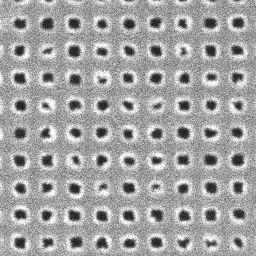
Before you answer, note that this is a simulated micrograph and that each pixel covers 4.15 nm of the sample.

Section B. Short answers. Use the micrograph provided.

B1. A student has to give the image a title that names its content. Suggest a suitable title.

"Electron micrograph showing a regular array of holes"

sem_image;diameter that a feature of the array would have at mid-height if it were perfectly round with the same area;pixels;11.5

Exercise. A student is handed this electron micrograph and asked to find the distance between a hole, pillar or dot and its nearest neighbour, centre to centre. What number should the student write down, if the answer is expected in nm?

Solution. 111